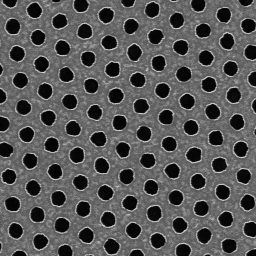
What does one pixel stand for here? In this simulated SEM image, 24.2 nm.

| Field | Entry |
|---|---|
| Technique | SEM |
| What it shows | a regular array of holes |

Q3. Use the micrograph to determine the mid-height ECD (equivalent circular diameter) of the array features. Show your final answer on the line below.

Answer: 357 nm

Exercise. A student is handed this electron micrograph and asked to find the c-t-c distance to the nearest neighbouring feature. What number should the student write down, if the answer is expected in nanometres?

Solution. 644